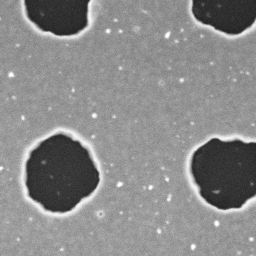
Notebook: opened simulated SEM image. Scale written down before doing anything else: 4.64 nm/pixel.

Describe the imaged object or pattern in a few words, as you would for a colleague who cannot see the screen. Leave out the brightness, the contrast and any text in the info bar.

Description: holes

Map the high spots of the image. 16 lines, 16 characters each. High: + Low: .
++....++++++....
++...++++++++...
++++++++++++++++
++++++++++++++++
++++++++++++++++
++++++++++++++++
++++++++++++++++
++++++++++++++++
+++.++++++++++++
++....++++++....
++....++++++....
++....++++++....
++...++++++++...
++++++++++++++++
++++++++++++++++
++++++++++++++++